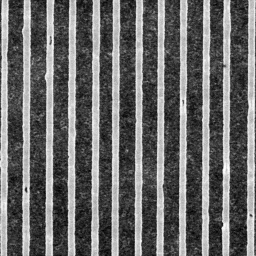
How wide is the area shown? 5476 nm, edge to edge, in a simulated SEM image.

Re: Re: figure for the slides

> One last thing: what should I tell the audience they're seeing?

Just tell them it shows parallel lines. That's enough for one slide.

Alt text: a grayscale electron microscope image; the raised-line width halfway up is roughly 134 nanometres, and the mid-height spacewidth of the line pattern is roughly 353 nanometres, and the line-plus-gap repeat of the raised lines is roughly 480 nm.